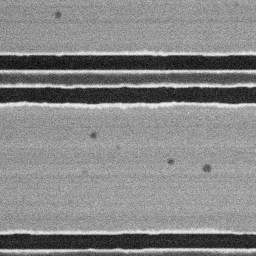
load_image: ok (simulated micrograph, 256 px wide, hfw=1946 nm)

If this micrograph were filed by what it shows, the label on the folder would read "lines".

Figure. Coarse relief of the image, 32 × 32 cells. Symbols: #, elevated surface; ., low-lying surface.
################################
################################
################################
################################
################################
################################
################################
................................
................................
################################
################################
................................
................................
################################
################################
################################
################################
################################
################################
################################
################################
################################
################################
################################
################################
################################
################################
################################
################################
................................
................................
################################